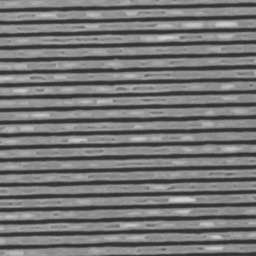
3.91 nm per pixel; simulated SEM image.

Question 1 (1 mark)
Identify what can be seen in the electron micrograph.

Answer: parallel lines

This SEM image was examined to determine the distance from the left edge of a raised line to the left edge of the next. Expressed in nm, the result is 48.7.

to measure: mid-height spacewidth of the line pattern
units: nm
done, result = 15.1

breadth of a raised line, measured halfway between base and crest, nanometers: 33.7